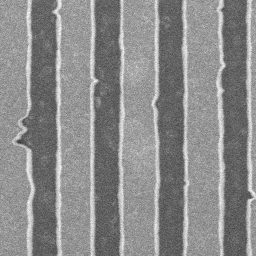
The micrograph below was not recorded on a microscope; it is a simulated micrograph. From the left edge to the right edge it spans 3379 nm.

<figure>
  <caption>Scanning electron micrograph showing one or a few lines or trenches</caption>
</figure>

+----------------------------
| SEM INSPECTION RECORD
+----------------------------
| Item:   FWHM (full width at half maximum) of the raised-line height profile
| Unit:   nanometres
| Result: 475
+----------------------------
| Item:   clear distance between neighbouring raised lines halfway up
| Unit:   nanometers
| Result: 371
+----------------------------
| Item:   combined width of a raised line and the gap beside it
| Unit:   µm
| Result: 0.844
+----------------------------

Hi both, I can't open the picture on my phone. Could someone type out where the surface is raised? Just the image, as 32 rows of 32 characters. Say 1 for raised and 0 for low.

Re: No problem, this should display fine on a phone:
11110001111100011110000111110001
11110001111100011111000111100001
11110001111100011111000111110001
11110001111100011111000111110001
11110001111100011111000111110001
11110001111100011111000111110001
11110001111100011111000111110001
11110001111100011111000111110001
11110001111000011111000111110001
11110001111100011111000111100001
11110001111100011111000111100001
11110001111000011111000111110001
11110001111000011110000111100001
11110001111000011110000111110001
11100001111000011110000111110001
11000001111000011110000111110001
11100001111100011110000111110001
11000001111100011111000111110001
11100001111000011111000111110001
11110001111100011111000111110001
11110001111000011111000111110001
11110001111100011111000111110001
11110001111100011111000111110001
11110001111100011111000111110001
11110001111000011111000111110001
11110001111100011111000111110001
11110001111100011111000111110001
11110001111100011111000111110001
11110001111100011111000111110001
11110001111100011111000111110001
11110001111100011111000111110001
11110001111100011111000111110001